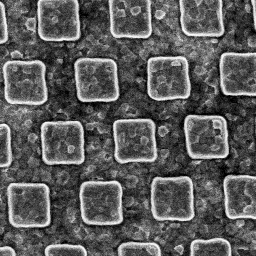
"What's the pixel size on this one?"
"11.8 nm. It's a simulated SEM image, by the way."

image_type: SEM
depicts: a regular array of raised bodies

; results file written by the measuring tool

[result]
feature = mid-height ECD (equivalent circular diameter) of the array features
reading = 529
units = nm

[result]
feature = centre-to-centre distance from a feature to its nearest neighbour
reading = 0.832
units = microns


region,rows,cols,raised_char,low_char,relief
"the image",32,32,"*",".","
.....*****....*****....*****....
*....*****....*****....*****....
*....*****....*****....*****....
*....*****....*****....*****....
*....*****......**..............
................................
................................
..........***......****.....****
.****....******....****.....****
.****.....****.....****.....****
.*****....*****....*****....****
.*****....*****....*****....****
.*****....****..................
................................
................................
......****....*****....*****....
*....*****....*****....*****....
*....*****....*****....*****....
*....*****.....****....*****....
*....*****.....****.....****....
*...............................
................................
....................****....****
.*****....*****....*****....****
.*****....*****....*****....****
.*****....*****....*****....****
.*****....*****....*****....****
.*****.....****.................
................................
................................
................***.....*****...
**....*****....*****....*****...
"